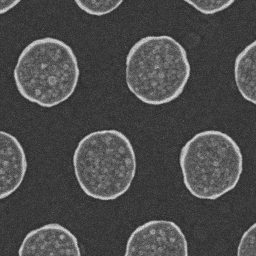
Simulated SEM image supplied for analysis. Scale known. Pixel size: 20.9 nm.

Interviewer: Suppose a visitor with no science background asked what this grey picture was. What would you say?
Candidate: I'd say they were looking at raised bodies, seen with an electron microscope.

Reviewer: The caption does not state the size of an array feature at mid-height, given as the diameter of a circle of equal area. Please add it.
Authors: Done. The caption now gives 1.32 µm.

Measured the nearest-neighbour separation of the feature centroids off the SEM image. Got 2240 nm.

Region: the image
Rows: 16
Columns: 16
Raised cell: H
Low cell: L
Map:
HLLLLHHLLLLLHHLL
LLLLLLLLLLLLLLLL
LLLLLLLLLHHLLLLL
LHHHHLLLHHHHLLLH
LHHHHLLLHHHHLLLH
LHHHHLLLHHHLLLLH
LLLLLLLLLLLLLLLL
LLLLLLLLLLLLLLLL
HLLLLLHHLLLLHHLL
HLLLLHHHLLLLHHHL
HHLLLHHHLLLHHHHL
HLLLLHHHLLLLHHHL
LLLLLLLLLLLLLLLL
LLLLLLLLLLLLLLLL
LLHHLLLLLHHLLLLH
LHHHHLLLHHHHLLLH